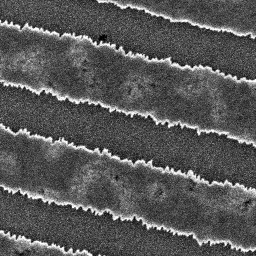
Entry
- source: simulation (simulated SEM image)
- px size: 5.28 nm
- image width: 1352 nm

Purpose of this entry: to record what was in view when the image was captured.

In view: one or a few lines or trenches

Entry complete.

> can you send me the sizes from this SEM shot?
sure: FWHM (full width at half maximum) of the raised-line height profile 313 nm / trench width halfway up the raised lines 42.8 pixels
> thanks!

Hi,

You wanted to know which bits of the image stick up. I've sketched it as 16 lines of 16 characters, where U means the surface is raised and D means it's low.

DDDDDDDDUUUUUUUU
UDDDDDDDDDDDUUUU
UUUUUUDDDDDDDDDD
UUUUUUUUUDDDDDDD
UUUUUUUUUUUUUUDD
DDUUUUUUUUUUUUUU
DDDDDDUUUUUUUUUU
DDDDDDDDDDUUUUUU
UUDDDDDDDDDDDDUU
UUUUUUDDDDDDDDDD
UUUUUUUUUUDDDDDD
UUUUUUUUUUUUUUUD
DDDUUUUUUUUUUUUU
DDDDDDDUUUUUUUUU
DDDDDDDDDDDUUUUU
UUUUDDDDDDDDDDDU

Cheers